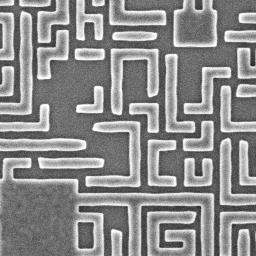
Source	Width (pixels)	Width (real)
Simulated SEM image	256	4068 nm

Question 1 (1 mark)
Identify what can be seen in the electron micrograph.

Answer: wiring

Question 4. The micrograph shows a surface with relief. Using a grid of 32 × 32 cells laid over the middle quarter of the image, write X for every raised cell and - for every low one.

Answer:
------------XX-------XX---XX----
------------XX-------XX---XX----
------------XX-------XX---XX----
------------XX-------XX---XX----
------------XX-------XX---XX----
------------XX-------XX---XX----
--------XX--XX-------XX---XX----
--------XX--XX-------XX---XX----
--------XX--XX------------XX----
--------XX--XX------------XX----
----XXXXXX--XX---XXXXXX---XX--XX
---XXXXXXX--XX---XXXXXX---XX--XX
-------------X---X--XXX---XX----
---------------------XX---XX----
------------XXXXXX---XX---XXXXXX
--------XXXXXXXXXXX--XX---XXXXXX
--------XXXXXXXXXXX--XX---XXXXXX
-----------------XX-------------
-----------------XX-------------
XXXXX------------XX--XXXXXXX--XX
XXXXX------------XX--XXXXXXX--XX
XXXX-------------XX--XXXXX----XX
-----------------XX--XXX--------
-----------------XX--XX---------
XXXXXXXXXX-------XX--XX-------XX
XXXXXXXXXX-------XX--XX-------XX
-----------------XX--XX-------XX
-----------------XX--XX-------XX
------XXXXXXXXXXXXX--XXXXXXX--XX
XXX---XXXXXXXXXXXXX--XXXXXXX--XX
XXX---X---XXXX--XXX-------------
XXX-----------------------------